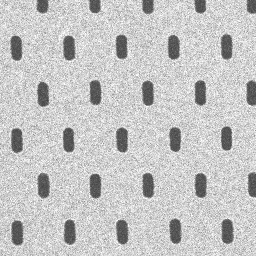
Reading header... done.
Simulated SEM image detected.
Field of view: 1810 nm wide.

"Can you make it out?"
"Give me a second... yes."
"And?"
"a regular array of holes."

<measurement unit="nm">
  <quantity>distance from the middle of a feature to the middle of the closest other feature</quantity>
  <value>368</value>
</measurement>